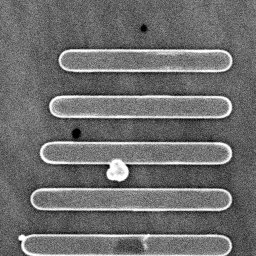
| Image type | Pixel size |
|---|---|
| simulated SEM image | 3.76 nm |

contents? groups of lines, slits or small figures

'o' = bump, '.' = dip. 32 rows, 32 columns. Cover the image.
................................
................................
................................
................................
................................
................................
........oooooooooooooooooooo....
.......oooooooooooooooooooooo...
........oooooooooooooooooooo....
................................
................................
................................
.......ooooooooooooooooooooo....
......ooooooooooooooooooooooo...
.......ooooooooooooooooooooo....
................................
................................
................................
.....oooooooooooooooooooooooo...
.....oooooooooooooooooooooooo...
.............ooo................
.............ooo................
................................
................................
....ooooooooooooooooooooooooo...
....ooooooooooooooooooooooooo...
................................
................................
................................
....oooooooooooooooooooooooo....
...oooooooooooooooooooooooooo...
...oooooooooooooooooooooooooo...